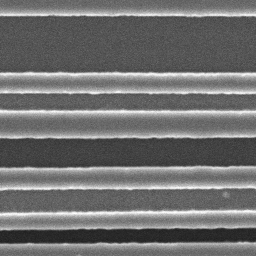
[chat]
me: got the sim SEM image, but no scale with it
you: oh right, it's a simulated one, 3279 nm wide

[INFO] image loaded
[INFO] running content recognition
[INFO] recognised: lines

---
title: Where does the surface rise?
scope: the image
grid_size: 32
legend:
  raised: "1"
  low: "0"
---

11111111111111111111111111111111
11111111111111111111111111111111
00000000000000000000000000000000
00000000000000000000000000000000
00000000000000000000000000000000
00000000000000000000000000000000
00000000000000000000000000000000
00000000000000000000000000000000
00000000000000000000000000000000
11111111111111111111111111111111
11111111111111111111111111111111
11111111111111111111111111111111
11111111111111111111111111111111
11111111111111111111111111111111
11111111111111111111111111111111
11111111111111111111111111111111
11111111111111111111111111111111
00000000000000000000000000000000
00000000000000000000000000000000
00000000000000000000000000000000
00000000000000000000000000000000
11111111111111111111111111111111
11111111111111111111111111111111
11111111111111111111111111111111
11111111111111111111111111111111
11111111111111111111111111111111
11111111111111111111111111111111
11111111111111111111111111111111
11111111111101000100000000000000
00000000000000000000000000000000
00011000100011111111111111111111
11111111111111111111111111111111